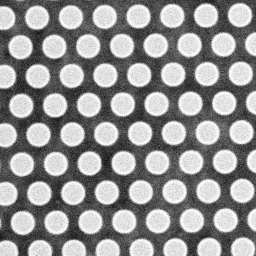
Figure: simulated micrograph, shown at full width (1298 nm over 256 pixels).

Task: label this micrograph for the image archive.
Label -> an array of small figures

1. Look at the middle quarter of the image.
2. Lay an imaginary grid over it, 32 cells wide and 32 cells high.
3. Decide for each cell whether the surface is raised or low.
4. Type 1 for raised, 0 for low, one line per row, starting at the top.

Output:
01100000011100000111100000111000
11110000111110001111100001111100
11111000111110001111110001111100
11111000111110001111110001111100
11110000111110000111100001111000
01100000011000000000000000000000
00000000000000000000000000000000
00000000000000110000001100000011
00001111100011111000011110000111
00001111100011111000111111000111
00001111100011111100111111000111
00001111100011111000011110000111
00000111000001110000001110000001
00000000000000000000000000000000
00000000000000000000000000010000
11110000111110000111100001111100
11111000111110001111110001111100
11111000111110001111110001111100
11111000111110001111100001111100
11110000011100000111100000111000
00000000000000000000000000000000
00000000000000000000000000000000
00000111000001110000011110000011
00001111100011111000011111000111
10001111100011111100011111000111
10001111100011111000011111000111
00001111100001111000011111000011
00000010000000110000000000000000
00000000000000000000000000000000
01100000001100000011100000111000
11111000111110000111110001111100
11111000111110001111110001111100